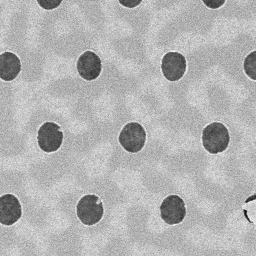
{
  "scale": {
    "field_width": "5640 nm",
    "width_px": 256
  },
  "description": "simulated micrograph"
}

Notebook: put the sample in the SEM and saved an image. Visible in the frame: holes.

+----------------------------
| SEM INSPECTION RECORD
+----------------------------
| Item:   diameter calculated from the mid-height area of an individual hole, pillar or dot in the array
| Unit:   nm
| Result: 634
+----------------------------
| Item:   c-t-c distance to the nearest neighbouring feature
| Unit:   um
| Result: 1.81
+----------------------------